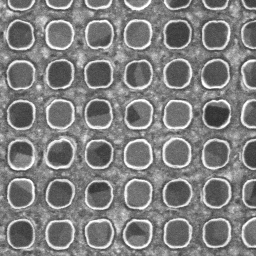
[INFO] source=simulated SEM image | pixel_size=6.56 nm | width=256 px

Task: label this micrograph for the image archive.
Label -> a regular array of raised bodies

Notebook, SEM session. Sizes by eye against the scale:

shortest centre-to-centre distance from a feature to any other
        254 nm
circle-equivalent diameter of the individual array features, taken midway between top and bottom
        190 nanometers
